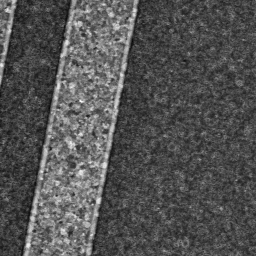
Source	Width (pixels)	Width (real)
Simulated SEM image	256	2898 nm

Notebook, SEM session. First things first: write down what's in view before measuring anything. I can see one or a few lines or trenches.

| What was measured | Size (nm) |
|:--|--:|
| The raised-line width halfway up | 691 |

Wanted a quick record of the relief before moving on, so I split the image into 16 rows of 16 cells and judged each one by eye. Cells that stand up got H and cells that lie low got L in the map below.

HLLLLHHHLLLLLLLL
HLLLHHHHLLLLLLLL
LLLLHHHHLLLLLLLL
LLLLHHHHLLLLLLLL
LLLLHHHHLLLLLLLL
LLLLHHHLLLLLLLLL
LLLHHHHLLLLLLLLL
LLLHHHHLLLLLLLLL
LLLHHHHLLLLLLLLL
LLLHHHHLLLLLLLLL
LLLHHHHLLLLLLLLL
LLHHHHLLLLLLLLLL
LLHHHHLLLLLLLLLL
LLHHHHLLLLLLLLLL
LLHHHHLLLLLLLLLL
LLHHHHLLLLLLLLLL